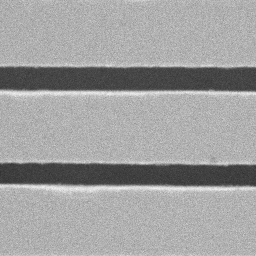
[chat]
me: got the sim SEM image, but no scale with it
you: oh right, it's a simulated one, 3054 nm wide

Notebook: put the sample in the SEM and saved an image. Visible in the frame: lines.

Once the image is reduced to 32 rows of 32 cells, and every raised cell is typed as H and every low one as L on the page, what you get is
HHHHHHHHHHHHHHHHHHHHHHHHHHHHHHHH
HHHHHHHHHHHHHHHHHHHHHHHHHHHHHHHH
HHHHHHHHHHHHHHHHHHHHHHHHHHHHHHHH
HHHHHHHHHHHHHHHHHHHHHHHHHHHHHHHH
HHHHHHHHHHHHHHHHHHHHHHHHHHHHHHHH
HHHHHHHHHHHHHHHHHHHHHHHHHHHHHHHH
HHHHHHHHHHHHHHHHHHHHHHHHHHHHHHHH
HHHHHHHHHHHHHHHHHHHHHHHHHHHHHHHH
LLLLLLLLLLLLLLLLLLLLLLLLLLLLLLLL
LLLLLLLLLLLLLLLLLLLLLLLLLLLLLLLL
LLLLLLLLLLLLLLLLLLLLLLLLLLLLLLLL
HHHHHHHHHHHHHHHHHLHHHHHHHHLLLLLL
HHHHHHHHHHHHHHHHHHHHHHHHHHHHHHHH
HHHHHHHHHHHHHHHHHHHHHHHHHHHHHHHH
HHHHHHHHHHHHHHHHHHHHHHHHHHHHHHHH
HHHHHHHHHHHHHHHHHHHHHHHHHHHHHHHH
HHHHHHHHHHHHHHHHHHHHHHHHHHHHHHHH
HHHHHHHHHHHHHHHHHHHHHHHHHHHHHHHH
HHHHHHHHHHHHHHHHHHHHHHHHHHHHHHHH
HHHHHHHHHHHHHHHHHHHHHHHHHHHHHHHH
LLLLLLLLLLLLLLLLLLLLLLLLLLHHHLLL
LLLLLLLLLLLLLLLLLLLLLLLLLLLLLLLL
LLLLLLLLLLLLLLLLLLLLLLLLLLLLLLLL
HHHHHHHHHHHHHHHHHHHHHHHHHHHHHHHH
HHHHHHHHHHHHHHHHHHHHHHHHHHHHHHHH
HHHHHHHHHHHHHHHHHHHHHHHHHHHHHHHH
HHHHHHHHHHHHHHHHHHHHHHHHHHHHHHHH
HHHHHHHHHHHHHHHHHHHHHHHHHHHHHHHH
HHHHHHHHHHHHHHHHHHHHHHHHHHHHHHHH
HHHHHHHHHHHHHHHHHHHHHHHHHHHHHHHH
HHHHHHHHHHHHHHHHHHHHHHHHHHHHHHHH
HHHHHHHHHHHHHHHHHHHHHHHHHHHHHHHH